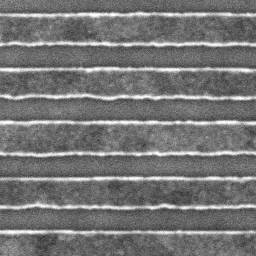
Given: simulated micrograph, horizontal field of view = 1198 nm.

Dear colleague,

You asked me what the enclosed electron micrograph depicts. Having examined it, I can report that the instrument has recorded lines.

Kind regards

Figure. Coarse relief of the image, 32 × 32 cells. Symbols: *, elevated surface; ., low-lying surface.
................................
................................
********************************
********************************
********************************
*******..***********************
................................
................................
................................
********************************
********************************
********************************
................................
................................
................................
********************************
********************************
********************************
********************************
................................
................................
................................
********************************
********************************
********************************
********************************
................................
................................
................................
********************************
********************************
********************************